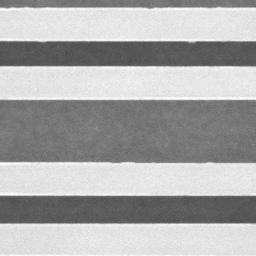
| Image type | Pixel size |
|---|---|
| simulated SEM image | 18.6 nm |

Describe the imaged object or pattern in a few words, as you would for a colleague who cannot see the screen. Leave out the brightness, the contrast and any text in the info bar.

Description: lines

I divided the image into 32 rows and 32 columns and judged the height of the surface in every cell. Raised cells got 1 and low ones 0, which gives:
00000000000000000000000000000000
11111111111111111111111111111111
11111111111111111111111111111111
11111111111111111111111111111111
11111111111111111111111111111111
00000000000000000000000000000000
00000000000000000000000000000000
00000000000000000000000000000000
11111111111111111111111111111111
11111111111111111111111111111111
11111111111111111111111111111111
11111111111111111111111111111111
00000000000000000000000000000000
00000000000000000000000000000000
00000000000000000000000000000000
00000000000000000000000000000000
00000000000000000000000000000000
00000000000000000000000000000000
00000000000000000000000000000000
00000000000000000000000000000000
11111111111111111111111111111111
11111111111111111111111111111111
11111111111111111111111111111111
11111111111111111111111111111111
00000000000000000000000000000000
00000000000000000000000000000000
00000000000000000000000000000000
00000000000000000000000000000000
11111111111111111111111111111111
11111111111111111111111111111111
11111111111111111111111111111111
11111111111111111111111111111111